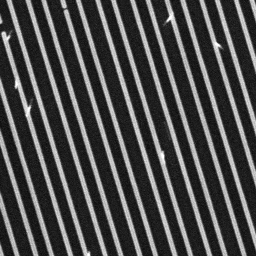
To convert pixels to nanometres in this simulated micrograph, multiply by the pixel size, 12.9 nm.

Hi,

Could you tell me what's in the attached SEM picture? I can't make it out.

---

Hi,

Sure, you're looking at parallel lines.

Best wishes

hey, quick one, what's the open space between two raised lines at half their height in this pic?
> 155 nanometers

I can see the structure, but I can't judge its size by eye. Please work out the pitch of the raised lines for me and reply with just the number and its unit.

215 nm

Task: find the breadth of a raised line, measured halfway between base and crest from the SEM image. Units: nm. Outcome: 46.4